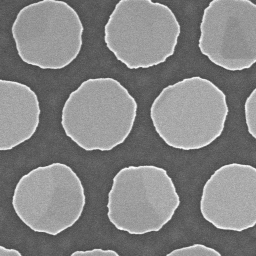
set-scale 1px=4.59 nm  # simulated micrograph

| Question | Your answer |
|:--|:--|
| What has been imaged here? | raised bodies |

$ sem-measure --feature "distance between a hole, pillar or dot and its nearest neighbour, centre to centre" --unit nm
421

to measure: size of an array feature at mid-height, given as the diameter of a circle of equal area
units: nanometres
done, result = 326